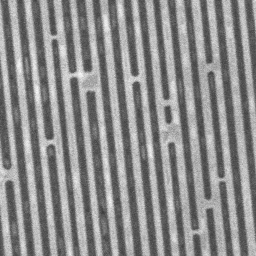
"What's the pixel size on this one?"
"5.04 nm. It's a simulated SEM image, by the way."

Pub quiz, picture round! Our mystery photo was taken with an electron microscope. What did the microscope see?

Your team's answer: parallel lines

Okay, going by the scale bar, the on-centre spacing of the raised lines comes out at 76.4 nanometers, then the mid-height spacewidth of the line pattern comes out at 0.0394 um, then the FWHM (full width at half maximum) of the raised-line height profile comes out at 35.7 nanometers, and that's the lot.